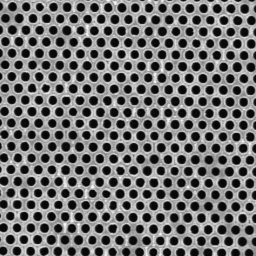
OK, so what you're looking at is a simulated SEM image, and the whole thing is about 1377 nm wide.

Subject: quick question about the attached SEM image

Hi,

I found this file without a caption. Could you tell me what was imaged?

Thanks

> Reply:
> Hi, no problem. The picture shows a regular array of holes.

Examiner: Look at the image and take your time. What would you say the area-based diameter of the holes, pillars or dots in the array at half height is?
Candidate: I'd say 0.0481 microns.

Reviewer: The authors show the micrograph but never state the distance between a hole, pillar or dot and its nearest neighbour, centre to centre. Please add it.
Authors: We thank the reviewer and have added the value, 71.1 nm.